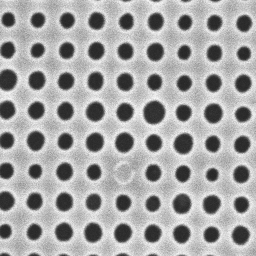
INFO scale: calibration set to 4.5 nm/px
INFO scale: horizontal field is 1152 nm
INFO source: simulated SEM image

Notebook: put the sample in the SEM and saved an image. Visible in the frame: a regular array of holes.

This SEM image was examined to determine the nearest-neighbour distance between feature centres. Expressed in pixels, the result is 29.4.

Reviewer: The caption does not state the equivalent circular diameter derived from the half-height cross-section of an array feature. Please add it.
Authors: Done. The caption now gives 71.7 nanometres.